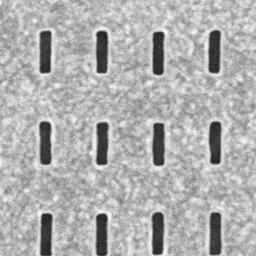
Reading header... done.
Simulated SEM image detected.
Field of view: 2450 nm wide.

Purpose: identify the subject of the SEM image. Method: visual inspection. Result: a regular array of holes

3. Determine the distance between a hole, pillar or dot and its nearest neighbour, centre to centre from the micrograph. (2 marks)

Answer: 540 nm